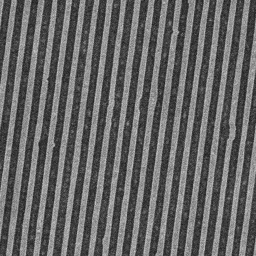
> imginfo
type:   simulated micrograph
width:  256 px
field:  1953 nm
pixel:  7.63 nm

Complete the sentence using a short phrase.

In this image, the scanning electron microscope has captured parallel lines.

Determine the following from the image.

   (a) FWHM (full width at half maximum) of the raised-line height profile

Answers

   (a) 39.7 nm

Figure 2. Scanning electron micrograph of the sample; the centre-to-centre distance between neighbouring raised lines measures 0.104 um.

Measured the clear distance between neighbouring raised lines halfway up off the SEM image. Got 0.0605 micrometres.